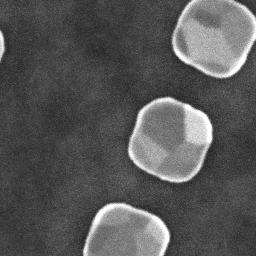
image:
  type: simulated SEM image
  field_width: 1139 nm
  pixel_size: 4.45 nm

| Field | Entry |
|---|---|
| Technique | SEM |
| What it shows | raised bodies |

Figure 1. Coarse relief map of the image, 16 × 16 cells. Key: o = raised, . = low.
............ooo.
...........ooooo
...........ooooo
...........oooo.
.............oo.
................
.........oo.....
.........oooo...
........ooooo...
........ooooo...
.........ooo....
................
................
......ooo.......
......oooo......
.....ooooo......